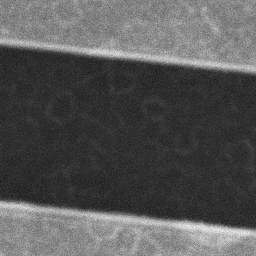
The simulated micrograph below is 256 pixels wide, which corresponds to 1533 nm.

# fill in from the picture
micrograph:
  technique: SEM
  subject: one or a few lines or trenches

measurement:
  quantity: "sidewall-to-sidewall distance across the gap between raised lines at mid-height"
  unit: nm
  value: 984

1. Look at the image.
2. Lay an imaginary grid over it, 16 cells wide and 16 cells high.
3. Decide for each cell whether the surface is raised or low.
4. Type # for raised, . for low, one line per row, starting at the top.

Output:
################
################
################
.........#######
................
................
................
................
................
................
................
................
................
######..........
###############.
################